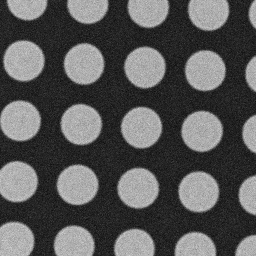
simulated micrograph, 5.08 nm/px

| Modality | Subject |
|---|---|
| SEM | an array of small figures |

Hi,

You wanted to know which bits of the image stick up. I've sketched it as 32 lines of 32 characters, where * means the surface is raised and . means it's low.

.*****...****...*****...****...*
.****....****...*****...*****..*
..........**.....***....****...*
.........................**.....
................................
..**............................
.****....***.....***.....*......
.****...*****...****....****...*
.****...*****...*****..*****...*
.****....***....****...*****...*
.................***....****...*
................................
................................
.***.....**......*..............
*****...****....****....***.....
*****...*****..*****...*****...*
*****...****...*****...*****..**
..*......***....****...*****..**
........................***....*
................................
.**.............................
****....****....***.............
*****..*****...*****...****....*
*****..*****...*****..*****...**
****....****...*****..*****...**
.........*......***....****...**
...............................*
................................
***.....**......................
****...****....****....***.....*
****...*****..*****...*****...**
****...*****..*****...*****...**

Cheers